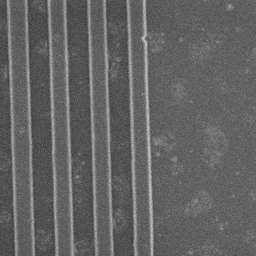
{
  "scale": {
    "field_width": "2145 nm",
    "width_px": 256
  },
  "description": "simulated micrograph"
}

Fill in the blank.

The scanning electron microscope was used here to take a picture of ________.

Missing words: parallel lines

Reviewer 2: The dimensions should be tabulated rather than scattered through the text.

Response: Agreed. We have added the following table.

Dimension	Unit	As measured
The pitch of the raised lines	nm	332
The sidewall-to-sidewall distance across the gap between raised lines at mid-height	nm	186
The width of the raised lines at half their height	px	17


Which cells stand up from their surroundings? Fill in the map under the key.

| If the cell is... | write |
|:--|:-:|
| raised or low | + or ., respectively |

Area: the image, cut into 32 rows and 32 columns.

.++...++...++...++..............
.++...++...++...++..............
.++...++...++...++..............
.++...++...++...++..............
.++...++...++...++..............
.++...++...++...++..............
.++...++...++...++..............
.+++..++...++...++..............
.+++..++...++...++..............
.+++..++...++...++..............
.+++..++...++...++..............
.+++..++...++...++..............
.+++..++...++...++..............
.+++...+...++...++..............
.+++..++...++...++..............
..++...++...++...++.............
..++...++...++..+++.............
..++...++...++..+++.............
..++...++...++...++.............
..++...++...++...++.............
..++...++...++...++.............
..++...++...++...++.............
..++...++...++...++.............
..++...++...++...++.............
..++...++...++...++.............
..++...++...++...++.............
..++...++...++...++.............
..++...++...++...++.............
..++...++...++...++.............
..++...++...++...++.............
..++...++...++...++.............
..++...++...++...++.............